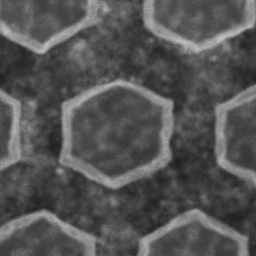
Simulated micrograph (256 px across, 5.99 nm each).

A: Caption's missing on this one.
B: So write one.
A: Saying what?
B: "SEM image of raised bodies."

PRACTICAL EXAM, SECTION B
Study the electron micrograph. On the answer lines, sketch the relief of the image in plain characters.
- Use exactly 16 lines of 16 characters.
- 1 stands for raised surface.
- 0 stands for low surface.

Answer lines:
1111110001111111
1111100001111110
0110000000011100
0000000000000000
0000000000000000
0000001110000000
1000011111000011
1000111111000011
1000111111000011
1000111111000011
0000011110000011
0000000000000000
0000000000000000
0010000000001000
1111100000111100
1111110001111110